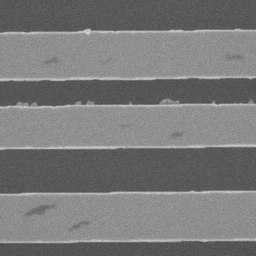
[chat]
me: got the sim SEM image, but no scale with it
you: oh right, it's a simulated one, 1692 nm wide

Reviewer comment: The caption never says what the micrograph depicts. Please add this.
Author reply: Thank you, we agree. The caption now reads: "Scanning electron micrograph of lines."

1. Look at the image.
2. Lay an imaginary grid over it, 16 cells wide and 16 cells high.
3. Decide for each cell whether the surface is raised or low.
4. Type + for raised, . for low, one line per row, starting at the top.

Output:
................
................
++++++++++++++++
++++++++++++++++
++++++++++++++++
................
...............+
++++++++++++++++
++++++++++++++++
................
................
................
++++++++++++++++
++++++++++++++++
++++++++++++++++
................